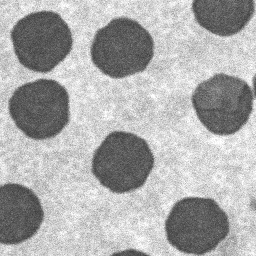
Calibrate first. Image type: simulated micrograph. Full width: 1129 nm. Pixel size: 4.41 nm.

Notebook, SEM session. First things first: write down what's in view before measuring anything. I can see holes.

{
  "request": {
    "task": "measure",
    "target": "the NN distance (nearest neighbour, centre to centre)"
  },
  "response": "327 nm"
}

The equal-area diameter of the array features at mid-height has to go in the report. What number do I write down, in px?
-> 60.9